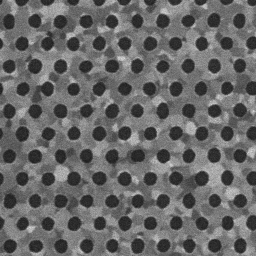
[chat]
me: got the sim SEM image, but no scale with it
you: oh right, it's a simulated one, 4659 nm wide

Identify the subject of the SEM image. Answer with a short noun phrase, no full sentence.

a regular array of holes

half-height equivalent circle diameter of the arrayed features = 0.261 microns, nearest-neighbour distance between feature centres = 460 nm